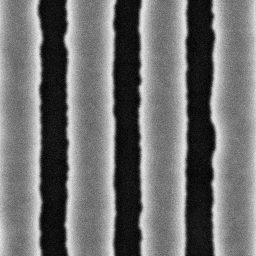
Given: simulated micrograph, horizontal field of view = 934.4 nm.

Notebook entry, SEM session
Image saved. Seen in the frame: lines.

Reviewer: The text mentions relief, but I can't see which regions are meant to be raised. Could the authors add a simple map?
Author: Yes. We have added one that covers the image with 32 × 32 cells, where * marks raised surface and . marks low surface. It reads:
*****...******....*****....*****
*****...******....*****....*****
*****...******....*****....*****
*****....*****...******....*****
*****...******....*****....*****
*****...******....*****....*****
*****....*****....*****....*****
*****....*****....*****....*****
*****....*****....*****....*****
*****...******....*****....*****
*****...******....*****....*****
*****...******....*****....*****
*****...******....*****...******
*****....*****...******...******
*****....*****...******...******
*****....*****...******....*****
*****...******....*****....*****
*****....*****....*****....*****
*****....*****....*****....*****
*****....*****....*****....*****
*****....*****....*****....*****
*****....*****....*****....*****
*****....*****....*****....*****
*****...******....*****....*****
*****....*****....*****....*****
*****...******....*****....*****
*****...******....*****....*****
*****...******....*****....*****
*****...******....*****....*****
*****...******....*****....*****
*****...******....*****....*****
*****....*****....*****....*****